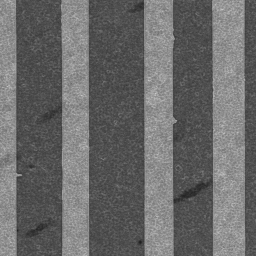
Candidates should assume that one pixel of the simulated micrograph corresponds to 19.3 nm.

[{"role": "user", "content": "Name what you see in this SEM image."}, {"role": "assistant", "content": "one or a few lines or trenches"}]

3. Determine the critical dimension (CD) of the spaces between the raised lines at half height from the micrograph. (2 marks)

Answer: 890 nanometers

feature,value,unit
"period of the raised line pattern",1480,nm